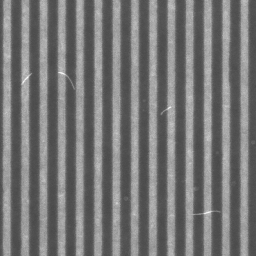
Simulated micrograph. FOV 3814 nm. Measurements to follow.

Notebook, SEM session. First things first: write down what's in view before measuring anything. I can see parallel lines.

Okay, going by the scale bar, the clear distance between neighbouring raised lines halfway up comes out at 95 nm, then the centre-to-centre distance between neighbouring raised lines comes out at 272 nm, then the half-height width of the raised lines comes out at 0.177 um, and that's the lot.